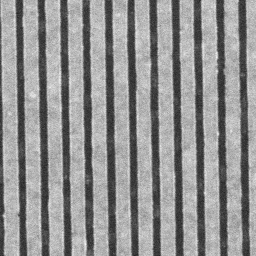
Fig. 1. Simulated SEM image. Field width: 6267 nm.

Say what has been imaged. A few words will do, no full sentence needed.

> parallel lines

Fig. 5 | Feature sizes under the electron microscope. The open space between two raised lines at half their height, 214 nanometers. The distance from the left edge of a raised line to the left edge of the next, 0.545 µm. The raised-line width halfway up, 321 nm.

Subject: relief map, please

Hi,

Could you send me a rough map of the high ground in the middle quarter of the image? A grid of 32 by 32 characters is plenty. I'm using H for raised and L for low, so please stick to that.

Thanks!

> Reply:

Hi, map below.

LLHHHLLHHHLLLHHHLLHHHHLLHHHLLHHH
LLHHHLLHHHLLLHHHLLHHHLLLHHHLLHHH
LLHHHLLHHHLLLHHHLLHHHLLLHHHLLHHH
LLHHHLLHHHLLLHHHLLHHHLLLHHHLLHHH
LLHHHLLHHHLLLHHHLLHHHLLLHHHLLHHH
LLHHHLLHHHLLLHHHLLHHHLLLHHHLLHHH
LLHHHLLHHHLLLHHHLLHHHLLLHHHLLHHH
LLHHHLLHHHLLLHHHLLHHHLLLHHHLLHHH
LHHHHLLHHHLLLHHHLLHHHLLLHHHLLLHH
LHHHHLLHHHLLLHHHLLHHHLLLHHHLLLHH
LHHHHLLHHHLLLHHHLLHHHLLLHHHLLLHH
LHHHHLLHHHLLLHHHLLHHHLLLHHHLLLHH
LHHHHLLHHHLLLHHHLLHHHHLLHHHLLLHH
LLHHHLLHHHLLLHHHLLHHHHLLHHHLLLHH
LLHHHLLHHHLLLHHHLLHHHHLLHHHLLHHH
LLHHHLLHHHLLLHHHLLHHHHLLHHHLLHHH
LLHHHLLHHHLLLHHHLLHHHHLLHHHLLLHH
LLHHHLLHHHLLLHHHLLHHHHLLHHHLLLHH
LLHHHLLHHHLLLHHHLLHHHHLLHHHLLLHH
LLHHHLLHHHLLLHHHLLLHHHLLHHHLLLHH
LLHHHLLHHHLLLHHHLLLHHHLLHHHLLLHH
LLHHHLLHHHLLLHHHLLLHHHLLHHHLLLHH
LLHHHLLHHHHLLHHHLLLHHHLLHHHLLLHH
LLHHHLLHHHHLLHHHLLLHHHLLHHHLLLHH
LLHHHLLHHHHLLHHHLLLHHHLLHHHLLLHH
LLHHHLLHHHLLLHHHLLLHHHLLHHHLLLHH
LLHHHLLHHHLLLHHHLLLHHHLLHHHLLLHH
LLHHHLLHHHLLLHHHLLLHHHLLHHHLLLHH
LLHHHLLHHHLLLHHHLLLHHHLLHHHLLLHH
LLHHHLLHHHLLLHHHLLLHHHLLHHHLLLHH
LLHHHLLHHHHLLHHHLLLHHHLLHHHLLLHH
LLHHHLLHHHHLLHHHLLLHHHLLHHHLLLHH